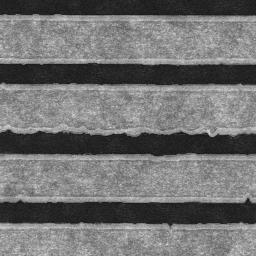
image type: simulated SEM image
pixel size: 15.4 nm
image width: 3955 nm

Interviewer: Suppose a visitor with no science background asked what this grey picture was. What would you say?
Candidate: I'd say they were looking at one or a few lines or trenches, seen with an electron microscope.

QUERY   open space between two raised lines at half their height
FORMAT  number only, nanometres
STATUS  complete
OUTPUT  411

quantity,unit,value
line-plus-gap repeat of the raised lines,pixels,69.4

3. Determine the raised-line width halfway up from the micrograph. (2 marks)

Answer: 666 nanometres